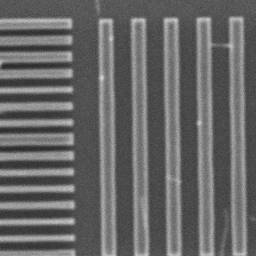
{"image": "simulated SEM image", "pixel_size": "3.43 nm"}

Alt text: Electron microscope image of groups of lines, slits or small figures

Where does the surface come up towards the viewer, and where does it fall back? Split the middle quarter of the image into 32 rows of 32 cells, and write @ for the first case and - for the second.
---------@@@-----@@@-----@@@----
@@-------@@@-----@@@-----@@@----
@@-------@@@-----@@@-----@@@----
---------@@@-----@@@-----@@@----
---------@@@-----@@@-----@@@----
---------@@@-----@@@-----@@@----
@@-------@@@-----@@@-----@@@----
---------@@@-----@@@-----@@@----
---------@@@-----@@@-----@@@----
---------@@@-----@@@------@@----
@@-------@@@-----@@@------@@----
---------@@@-----@@@------@@----
---------@@@-----@@@------@@@---
---------@@@------@@------@@@---
@@-------@@@------@@------@@@---
---------@@@-----@@@------@@@---
---------@@@-----@@@------@@@---
-@-------@@@-----@@@------@@@---
@@-------@@@-----@@@------@@@---
@@-------@@@------@@------@@@---
---------@@@------@@@-----@@@---
---------@@@------@@@-----@@@---
@@-------@@@------@@@-----@@@---
@@-------@@@------@@@-----@@@---
---------@@@------@@@-----@@@---
---------@@@------@@@-----@@@---
@@-------@@@------@@@-----@@@---
@@-------@@@------@@@-----@@@---
---------@@@------@@@-----@@@---
---------@@@------@@@-----@@@---
----------@@------@@@-----@@@---
@@--------@@------@@@-----@@@---